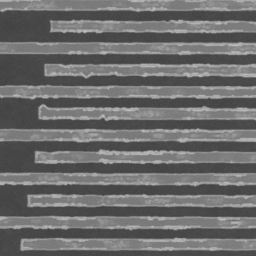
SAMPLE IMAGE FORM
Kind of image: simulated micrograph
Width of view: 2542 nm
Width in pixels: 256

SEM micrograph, parallel lines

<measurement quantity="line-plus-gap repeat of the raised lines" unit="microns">0.216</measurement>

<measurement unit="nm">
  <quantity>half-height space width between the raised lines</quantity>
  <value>107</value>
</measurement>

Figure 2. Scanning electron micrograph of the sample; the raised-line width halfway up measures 107 nm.